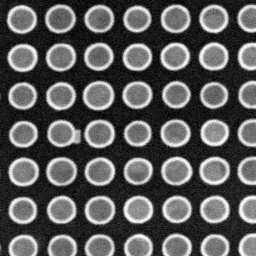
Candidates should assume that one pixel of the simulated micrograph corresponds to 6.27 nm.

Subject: a regular array of raised bodies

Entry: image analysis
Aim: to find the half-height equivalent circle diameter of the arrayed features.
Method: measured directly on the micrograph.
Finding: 162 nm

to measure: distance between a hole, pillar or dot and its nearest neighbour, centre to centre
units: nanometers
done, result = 237